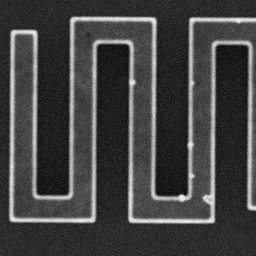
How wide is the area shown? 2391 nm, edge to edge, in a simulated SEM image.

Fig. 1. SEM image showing groups of lines, slits or small figures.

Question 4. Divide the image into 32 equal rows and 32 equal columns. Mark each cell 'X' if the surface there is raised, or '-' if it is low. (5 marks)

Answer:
--------------------------------
--------------------------------
---------XXXXXXXXXX-----XXXXXXXX
---------XXXXXXXXXX-----XXXXXXXX
--XX-----XXXXXXXXXX-----XXXXXXXX
--XX-----XXX----XXX-----XXX----X
--XX-----XXX----XXX-----XXX----X
--XX-----XXX----XXX-----XXX----X
--XX-----XXX----XXX-----XXX----X
--XX-----XXX----XXX-----XXX----X
--XX-----XXX----XXX-----XXX----X
--XX-----XXX----XXX-----XXX----X
--XX-----XXX----XXX-----XXX----X
--XX-----XXX----XXX-----XXX----X
--XX-----XXX----XXX-----XXX----X
--XX-----XXX----XXX-----XXX----X
--XX-----XXX----XXX-----XXX----X
--XX-----XXX----XXX-----XXX----X
--XX-----XXX----XXX-----XXX----X
--XX-----XXX----XXX-----XXX----X
--XX-----XXX----XXX-----XXX----X
--XX-----XXX----XXX-----XXX----X
-XXX-----XXX----XXX-----XXX----X
-XXX-----XXX----XXX-----XXX----X
-XXXX---XXXX----XXXX--XXXXX----X
-XXXXXXXXXXX----XXXXXXXXXXX----X
-XXXXXXXXXXX----XXXXXXXXXXX-----
--XXXXXXXXX------XXXXXXXXXX-----
--------------------------------
--------------------------------
--------------------------------
--------------------------------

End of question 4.